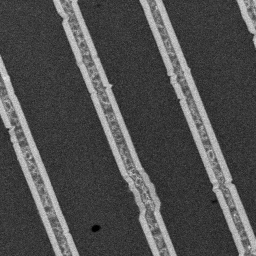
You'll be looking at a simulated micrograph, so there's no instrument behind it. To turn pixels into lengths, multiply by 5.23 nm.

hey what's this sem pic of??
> one or a few lines or trenches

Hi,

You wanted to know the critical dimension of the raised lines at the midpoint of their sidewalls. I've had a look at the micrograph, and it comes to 79.7 nm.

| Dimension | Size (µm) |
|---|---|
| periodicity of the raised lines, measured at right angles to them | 0.435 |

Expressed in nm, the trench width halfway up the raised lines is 342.